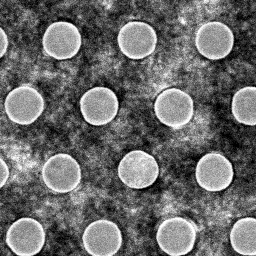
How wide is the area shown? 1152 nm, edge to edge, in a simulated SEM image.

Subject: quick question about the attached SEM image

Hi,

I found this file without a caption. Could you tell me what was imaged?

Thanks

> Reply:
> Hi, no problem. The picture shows a regular array of raised bodies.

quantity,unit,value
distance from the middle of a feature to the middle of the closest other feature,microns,0.338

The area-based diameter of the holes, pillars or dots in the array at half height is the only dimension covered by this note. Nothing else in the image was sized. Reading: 168 nm